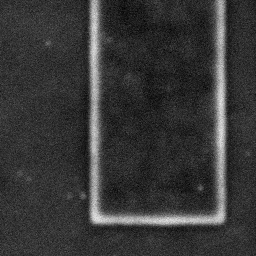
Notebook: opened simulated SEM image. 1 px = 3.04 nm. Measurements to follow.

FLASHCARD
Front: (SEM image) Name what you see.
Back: wiring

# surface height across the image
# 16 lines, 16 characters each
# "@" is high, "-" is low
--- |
------@@@@@@@@--
------@@@@@@@@--
------@@@@@@@@--
------@@@@@@@@--
------@@@@@@@@--
------@@@@@@@@--
------@@@@@@@@--
------@@@@@@@@--
------@@@@@@@@--
------@@@@@@@@--
------@@@@@@@@--
------@@@@@@@@--
------@@@@@@@@--
------@@@@@@@@--
----------------
----------------